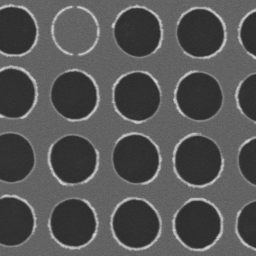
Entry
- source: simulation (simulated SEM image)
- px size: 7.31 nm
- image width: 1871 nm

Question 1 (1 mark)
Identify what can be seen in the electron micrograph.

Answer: a regular array of holes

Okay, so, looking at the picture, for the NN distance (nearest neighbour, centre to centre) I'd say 0.456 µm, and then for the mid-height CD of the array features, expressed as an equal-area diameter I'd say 344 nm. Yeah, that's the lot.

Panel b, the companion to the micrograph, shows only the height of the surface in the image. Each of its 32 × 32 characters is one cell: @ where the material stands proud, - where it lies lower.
@@@@@@@@@@@@@@@@@@@@@@@@@@@@@@@@
---@@@@@@@@@@@@@---@@@@@--@@@@@@
----@@@@@@@@@@@-----@@@----@@@@-
----@@@@@@@@@@------@@------@@--
----@@@@@@@@@@------@@------@@--
----@@@@@@@@@@@-----@@------@@--
---@@@@@@@@@@@@@---@@@@----@@@@-
@@@@@@@@@@@@@@@@@@@@@@@@@@@@@@@@
@@@@@@@@@@@@@@@@@@@@@@@@@@@@@@@@
---@@@@----@@@@@---@@@@---@@@@@-
----@@@-----@@@----@@@-----@@@--
----@@------@@------@@------@@--
----@@------@@------@@------@@--
----@@@-----@@@-----@@-----@@@--
@--@@@@@---@@@@@---@@@@----@@@@-
@@@@@@@@@@@@@@@@@@@@@@@@@@@@@@@@
@@@@@@@@@@@@@@@@@@@@@@@@@@@@@@@@
---@@@@----@@@@----@@@@---@@@@@@
----@@@-----@@-----@@@-----@@@--
----@@------@@------@@------@@--
----@@------@@------@@------@@--
----@@@-----@@@----@@@-----@@@--
---@@@@@---@@@@@---@@@@----@@@@-
@@@@@@@@@@@@@@@@@@@@@@@@@@@@@@@@
@@@@@@@@@@@@@@@@@@@@@@@@@@@@@@@@
---@@@@----@@@@---@@@@@---@@@@@-
----@@@-----@@-----@@@-----@@@--
----@@------@@------@@------@@--
----@@------@@------@@------@@--
----@@@-----@@@-----@@-----@@@--
--@@@@@@---@@@@----@@@@---@@@@@-
@@@@@@@@@@@@@@@@@@@@@@@@@@@@@@@@